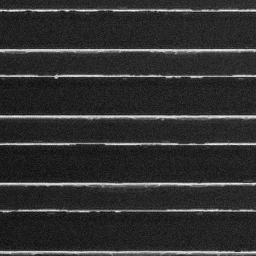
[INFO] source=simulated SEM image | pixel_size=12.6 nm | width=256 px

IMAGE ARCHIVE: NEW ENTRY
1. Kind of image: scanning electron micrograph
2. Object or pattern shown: lines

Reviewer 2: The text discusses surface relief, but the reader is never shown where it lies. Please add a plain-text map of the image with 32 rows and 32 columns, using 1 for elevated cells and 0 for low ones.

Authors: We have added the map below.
11111111111111111111111111111111
00000000000000000000000000000000
00000000000000000000000000000000
00000000000000000000000000000000
00000000000000000000000000000000
00000000000000000000000000000000
11111111111111111111111111111111
11111111111111111111111111111111
11111111111111111111111111111111
11111111111111111111111111111111
00000000000000000000000000000000
00000000000000000000000000000000
00000000000000000000000000000000
00000000000000000000000000000000
00000000000000000000000000000000
11111111111111111111111111111111
11111111111111111111111111111111
11111111111111111111111111111111
00000000000000000000000000000000
00000000000000000000000000000000
00000000000000000000000000000000
00000000000000000000000000000000
00000000000000000000000000000000
11111111111111111111111111111111
11111111111111111111111111111111
11111111111111111111111111111111
00000000000000000000000000000000
00000000000000000000000000000000
00000000000000000000000000000000
00000000000000000000000000000000
00000000000000000000000000000000
00001111000000000000000000000000